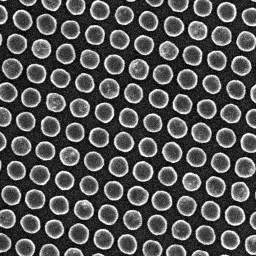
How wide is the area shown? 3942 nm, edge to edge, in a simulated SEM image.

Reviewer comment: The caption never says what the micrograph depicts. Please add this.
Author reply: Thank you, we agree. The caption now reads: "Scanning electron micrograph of a regular array of raised bodies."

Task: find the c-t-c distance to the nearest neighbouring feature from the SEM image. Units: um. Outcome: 0.376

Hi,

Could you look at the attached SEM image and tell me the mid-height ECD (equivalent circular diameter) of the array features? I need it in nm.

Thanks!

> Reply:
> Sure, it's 293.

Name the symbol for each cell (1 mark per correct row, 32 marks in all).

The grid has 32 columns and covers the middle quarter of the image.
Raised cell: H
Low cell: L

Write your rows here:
LLLLLHHHLLHHHHHLHHHHHLLLHHLLLLLL
LLLLLLLLLLLHHHHLHHHHHLLHHHHLLLHL
HLLLLLLLLLLLLLLLLHHHHLHHHHHLLHHH
HLLHHHHLLLLLLLLLLLHHLLHHHHHLHHHH
HLLHHHHLLLHHHLLLLLLLLLLHHHLLLHHH
HLLHHHHLLHHHHHLLHHLLLLLLLLLLLHHH
LLLLHHHLLHHHHHLHHHHLLLLHLLLLLLLL
LLLLLLLLLHHHHHLHHHHHLLHHHHLLLLLL
LLLLLLLLLLLHLLLLHHHLLHHHHHLLHHHL
LLHHHHLLLLLLLLLLLHHLLLHHHHLHHHHH
LLHHHHLLLHHHLLLLLLLLLLHHHLLHHHHH
LLHHHHLLHHHHLLLHHLLLLLLLLLLLHHHH
LLHHHHLLHHHHLLHHHHLLLLLLLLLLLLLL
LLLLLLLLHHHHLLHHHHLLHHHHLLLLHLLL
LLLLLLLLLLHLLLHHHHLLHHHHLLHHHHLL
LHHHLLLLLLLLLLLHHLLLHHHHLLHHHHHL
LHHHHLLHHHLLLLLLLLLLLHHHLLHHHHHL
LHHHHLLHHHHLLLHHLLLLLLLLLLLHHHLL
LHHHHLHHHHHLLHHHHLLLLLLLLLLLLLLL
LLLLLLLHHHHLLHHHHLLHHHHLLLLLLLLL
LLLLLLLLHHLLLHHHHLLHHHHLLHHHHLLL
HHHLLLLLLLLLLLHHLLLHHHHLLHHHHLLL
HHHHLLHHHLLLLLLLLLLLHHHLLHHHHLLH
HHHHLHHHHHLLLHHLLLLLLLLLLHHHHLLH
HHHLLHHHHHLLHHHHLLLHLLLLLLLLLLLH
LLLLLHHHHHLHHHHHLLHHHHLLLLLLLLLL
LLLLLLLHLLLHHHHHLLHHHHLLHHHLLLLL
HLLLLLLLLLLLHHHLLHHHHHLLHHHHLLLH
HHLLLHHLLLLLLLLLLLHHHHLLHHHHLLHH
HHLLHHHHLLLLHLLLLLLLLLLLHHHHLLHH
HHLLHHHHLLHHHHLLLLLLLLLLLLLLLLHH
LLLLHHHHLLHHHHHLLHHHLLLLLLLLLLLH